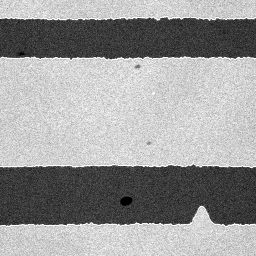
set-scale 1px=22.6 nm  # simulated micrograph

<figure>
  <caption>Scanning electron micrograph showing one or a few lines or trenches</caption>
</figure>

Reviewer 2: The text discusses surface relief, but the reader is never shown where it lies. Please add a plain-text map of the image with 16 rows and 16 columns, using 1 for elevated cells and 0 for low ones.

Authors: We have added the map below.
1111111111111111
0000000000000000
0000000000000000
0000000000000000
1111111111111111
1111111111111111
1111111111111111
1111111111111111
1111111111111111
1111111111111111
0000000000000000
0000000000000000
0000000000000000
0000000000001000
1111111111111111
1111111111111111